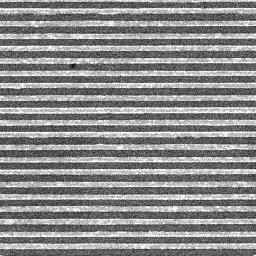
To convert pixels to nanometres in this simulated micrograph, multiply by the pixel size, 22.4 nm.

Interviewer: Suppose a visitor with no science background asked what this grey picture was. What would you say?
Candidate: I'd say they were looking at parallel lines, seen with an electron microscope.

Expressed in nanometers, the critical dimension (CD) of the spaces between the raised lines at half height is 176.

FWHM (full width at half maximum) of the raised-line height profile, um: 0.109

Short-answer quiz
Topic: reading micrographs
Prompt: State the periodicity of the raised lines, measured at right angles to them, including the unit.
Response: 277 nm